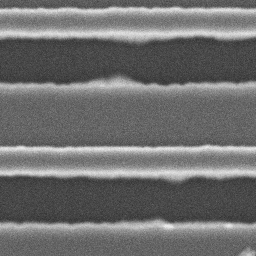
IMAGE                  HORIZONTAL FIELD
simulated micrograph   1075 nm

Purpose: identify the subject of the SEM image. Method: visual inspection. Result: lines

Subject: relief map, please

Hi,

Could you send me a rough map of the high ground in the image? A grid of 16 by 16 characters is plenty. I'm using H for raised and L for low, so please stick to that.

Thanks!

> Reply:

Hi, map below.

HHHHHHHHHHHHHHHH
HHHHHHHHHHHHHHHH
LLLLLLLLLLLLLLLL
LLLLLLLLLLLLLLLL
LLLLLLLLLLLLLLLL
HHHHHHHHHHHHHHHH
HHHHHHHHHHHHHHHH
HHHHHHHHHHHHHHHH
HHHHHHHHHHHHHHHH
HHHHHHHHHHHHHHHH
HHHHHHHHHHHHHHHH
LLLLLLLLLLLLLLLL
LLLLLLLLLLLLLLLL
LLLLLLLLLLLLLLLL
HHHHHHHHHHHHHHHH
HHHHHHHHHHHHHHHH